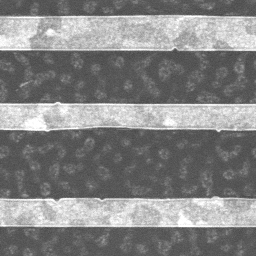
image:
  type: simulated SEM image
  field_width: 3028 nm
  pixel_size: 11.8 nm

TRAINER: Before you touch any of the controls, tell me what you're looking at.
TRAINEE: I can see one or a few lines or trenches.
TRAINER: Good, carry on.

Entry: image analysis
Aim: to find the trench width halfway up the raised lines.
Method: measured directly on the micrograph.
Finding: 0.731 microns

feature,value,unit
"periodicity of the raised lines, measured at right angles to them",1.06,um